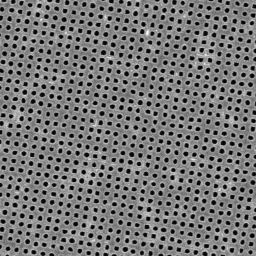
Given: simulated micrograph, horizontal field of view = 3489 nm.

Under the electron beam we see a regular array of holes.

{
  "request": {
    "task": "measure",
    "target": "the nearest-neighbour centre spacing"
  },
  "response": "112 nm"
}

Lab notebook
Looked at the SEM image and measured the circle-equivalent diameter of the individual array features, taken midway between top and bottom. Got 68.8 nanometres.